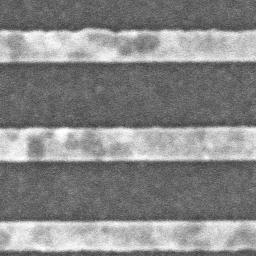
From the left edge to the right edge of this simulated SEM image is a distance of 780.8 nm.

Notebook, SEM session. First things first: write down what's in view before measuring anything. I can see one or a few lines or trenches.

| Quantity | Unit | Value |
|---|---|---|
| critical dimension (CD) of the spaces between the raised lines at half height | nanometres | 200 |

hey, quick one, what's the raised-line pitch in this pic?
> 0.289 µm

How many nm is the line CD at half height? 87.2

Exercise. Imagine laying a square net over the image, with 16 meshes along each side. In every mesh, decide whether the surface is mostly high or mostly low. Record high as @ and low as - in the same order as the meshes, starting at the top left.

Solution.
----------------
----------------
@@@@@@@@@@@@@@@@
@@@@@@@@@@@@@@@@
----------------
----------------
----------------
----------------
@@@@@@@@@@@@@@@@
@@@@@@@@@@@@@@@@
----------------
----------------
----------------
----------------
@@@@@@@@@@@@@@@@
@@@@@@@@@@@@@@@@